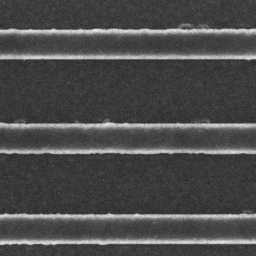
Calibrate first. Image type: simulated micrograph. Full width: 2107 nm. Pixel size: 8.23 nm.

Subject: lines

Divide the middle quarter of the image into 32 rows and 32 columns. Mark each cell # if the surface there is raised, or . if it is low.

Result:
................................
................................
................................
................................
................................
................................
................................
................................
................................
................................
................................
................................
................................
................................
................................
################################
################################
################################
################################
################################
################################
################################
................................
................................
................................
................................
................................
................................
................................
................................
................................
................................